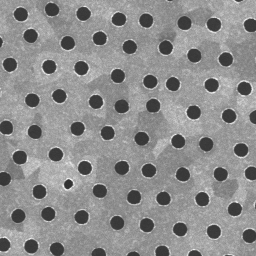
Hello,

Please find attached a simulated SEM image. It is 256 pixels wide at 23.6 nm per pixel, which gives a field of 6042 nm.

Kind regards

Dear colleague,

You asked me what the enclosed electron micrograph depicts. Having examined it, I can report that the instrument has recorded a regular array of holes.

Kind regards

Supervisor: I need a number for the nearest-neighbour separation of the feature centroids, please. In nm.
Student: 694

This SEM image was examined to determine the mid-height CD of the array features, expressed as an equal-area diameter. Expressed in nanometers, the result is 342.